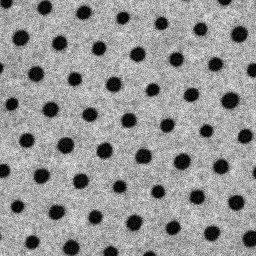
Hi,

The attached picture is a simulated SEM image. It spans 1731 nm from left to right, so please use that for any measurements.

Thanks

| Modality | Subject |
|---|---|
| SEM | a regular array of holes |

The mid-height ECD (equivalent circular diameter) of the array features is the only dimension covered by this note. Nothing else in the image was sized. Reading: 104 nanometres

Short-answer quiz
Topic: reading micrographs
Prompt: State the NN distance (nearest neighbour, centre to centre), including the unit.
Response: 261 nanometers